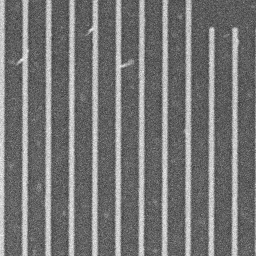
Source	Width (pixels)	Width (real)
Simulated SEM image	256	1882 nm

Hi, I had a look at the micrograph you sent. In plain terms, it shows parallel lines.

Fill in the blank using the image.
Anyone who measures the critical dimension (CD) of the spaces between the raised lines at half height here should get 144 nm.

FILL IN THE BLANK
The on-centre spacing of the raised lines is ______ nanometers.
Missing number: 171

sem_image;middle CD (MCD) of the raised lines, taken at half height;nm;28.5